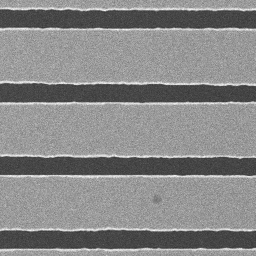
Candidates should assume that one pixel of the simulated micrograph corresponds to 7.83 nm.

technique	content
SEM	lines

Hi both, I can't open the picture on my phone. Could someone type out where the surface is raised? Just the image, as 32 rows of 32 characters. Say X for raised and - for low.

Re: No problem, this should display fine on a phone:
XXXXXXXXXXXXXXXXXXXXXXXXXXXXXXXX
--------------------------------
--------------------------------
--------------------------------
XXXXXXXXXXXXXXXXXXXXXXXXXXXXXXXX
XXXXXXXXXXXXXXXXXXXXXXXXXXXXXXXX
XXXXXXXXXXXXXXXXXXXXXXXXXXXXXXXX
XXXXXXXXXXXXXXXXXXXXXXXXXXXXXXXX
XXXXXXXXXXXXXXXXXXXXXXXXXXXXXXXX
XXXXXXXXXXXXXXXXXXXXXXXXXXXXXXXX
------X--XXX--XXXXX-XXXXXXXXXXXX
--------------------------------
--------------------------------
XXXXXXXXXXXXXXXXXXXXXXXXXXXXXXXX
XXXXXXXXXXXXXXXXXXXXXXXXXXXXXXXX
XXXXXXXXXXXXXXXXXXXXXXXXXXXXXXXX
XXXXXXXXXXXXXXXXXXXXXXXXXXXXXXXX
XXXXXXXXXXXXXXXXXXXXXXXXXXXXXXXX
XXXXXXXXXXXXXXXXXXXXXXXXXXXXXXXX
XXXXXXXXXXXXXXXXXXXXXXXXXXXXXXXX
--------------------------------
--------------------------------
XXXXXXXXXXXXXXXXXXXXXXXXXXXXXXXX
XXXXXXXXXXXXXXXXXXXXXXXXXXXXXXXX
XXXXXXXXXXXXXXXXXXXXXXXXXXXXXXXX
XXXXXXXXXXXXXXXXXXXXXXXXXXXXXXXX
XXXXXXXXXXXXXXXXXXXXXXXXXXXXXXXX
XXXXXXXXXXXXXXXXXXXXXXXXXXXXXXXX
XXXXXXXXXXXXXXXXXXXXXXXXXXXXXXXX
--------------------------------
--------------------------------
XXXXXXXXXXXXXXXXXXXXXXXXXXXXXXXX